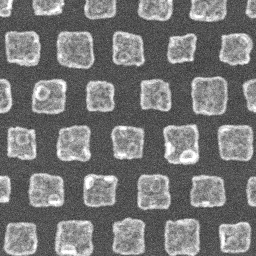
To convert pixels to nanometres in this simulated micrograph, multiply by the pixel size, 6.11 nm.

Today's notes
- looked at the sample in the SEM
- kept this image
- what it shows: a regular array of raised bodies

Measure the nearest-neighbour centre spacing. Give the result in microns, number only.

0.326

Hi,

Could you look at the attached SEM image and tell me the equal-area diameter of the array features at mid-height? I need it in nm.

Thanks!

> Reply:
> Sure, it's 210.